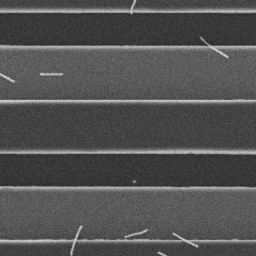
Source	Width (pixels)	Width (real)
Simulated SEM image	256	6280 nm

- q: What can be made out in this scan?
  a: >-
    lines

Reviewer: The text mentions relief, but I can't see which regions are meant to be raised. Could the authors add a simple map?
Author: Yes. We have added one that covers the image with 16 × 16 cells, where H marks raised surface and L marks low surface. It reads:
HHHHHHHHHHHHHHHH
LLLLLLLLLLLLLLLL
LLLLLLLLLLLLLLLL
HHHHHHHHHHHHHHHH
HHHHHHHHHHHHHHHH
HHHHHHHHHHHHHHHH
HHHHHHHHHHHHHHHH
HHHHHHHHHHHHHHHH
HHHHHHHHHHHHHHHH
HHHHHHHHHHHHHHHH
LLLLLLLLLLLLLLLL
LLLLLLLLLLLLLLLL
HHHHHHHHHHHHHHHH
HHHHHHHHHHHHHHHH
HHHHHHHHHHHHHHHH
HHHHHHHHHHHHHHHH